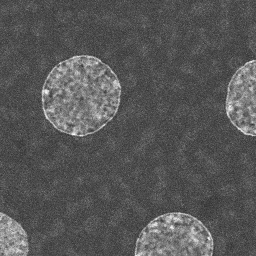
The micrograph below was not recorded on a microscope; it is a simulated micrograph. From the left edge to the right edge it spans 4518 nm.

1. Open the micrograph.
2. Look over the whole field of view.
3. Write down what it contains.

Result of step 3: raised bodies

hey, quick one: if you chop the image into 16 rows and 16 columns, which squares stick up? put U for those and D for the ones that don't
DDDDDDDDDDDDDDDD
DDDDDDDDDDDDDDDD
DDDDDDDDDDDDDDDD
DDDDDDDDDDDDDDDD
DDDUUUUDDDDDDDDU
DDDUUUUDDDDDDDUU
DDDUUUUDDDDDDDUU
DDDUUUUDDDDDDDUU
DDDDDDDDDDDDDDDD
DDDDDDDDDDDDDDDD
DDDDDDDDDDDDDDDD
DDDDDDDDDDDDDDDD
DDDDDDDDDDDDDDDD
DDDDDDDDDDUUDDDD
DDDDDDDDDUUUUDDD
DDDDDDDDDUUUUDDD